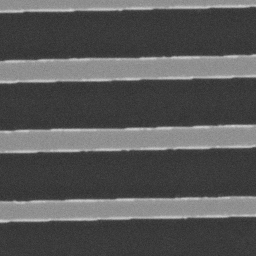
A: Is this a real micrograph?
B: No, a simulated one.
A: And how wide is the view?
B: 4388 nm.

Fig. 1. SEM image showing lines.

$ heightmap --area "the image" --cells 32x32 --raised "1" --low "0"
11111111111111111111111111111111
00000000000000000000000000000000
00000000000000000000000000000000
00000000000000000000000000000000
00000000000000000000000000000000
00000000000000000000000000000000
00000000000000000000000000000000
00000111111111111111111111111111
11111111111111111111111111111111
11111111111111111111111111111111
00000000000000000000000000000000
00000000000000000000000000000000
00000000000000000000000000000000
00000000000000000000000000000000
00000000000000000000000000000000
00000000000000000000000000000000
11111111111111111111111111111111
11111111111111111111111111111111
11111111111111111111111111000000
00000000000000000000000000000000
00000000000000000000000000000000
00000000000000000000000000000000
00000000000000000000000000000000
00000000000000000000000000000000
00000000000000000000000000000000
11111111111111111111111111111111
11111111111111111111111111111111
11111100000000000000000000000000
00000000000000000000000000000000
00000000000000000000000000000000
00000000000000000000000000000000
00000000000000000000000000000000